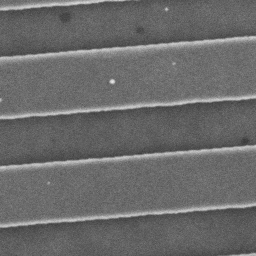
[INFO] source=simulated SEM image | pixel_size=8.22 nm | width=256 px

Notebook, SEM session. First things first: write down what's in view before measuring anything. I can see lines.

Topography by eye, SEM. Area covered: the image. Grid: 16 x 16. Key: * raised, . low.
*...............
................
.............***
..**************
****************
****************
***********.....
................
................
...........*****
****************
****************
****************
********........
................
................